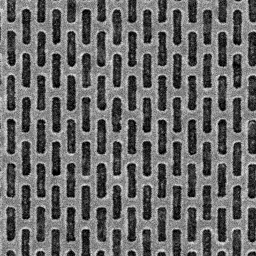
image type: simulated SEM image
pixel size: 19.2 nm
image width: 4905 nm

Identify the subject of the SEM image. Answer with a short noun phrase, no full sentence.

a regular array of holes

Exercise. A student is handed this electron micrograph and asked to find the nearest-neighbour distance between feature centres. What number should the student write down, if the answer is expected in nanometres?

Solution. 504